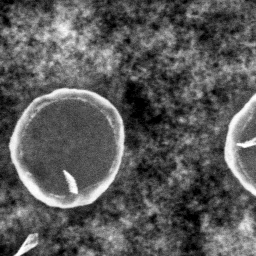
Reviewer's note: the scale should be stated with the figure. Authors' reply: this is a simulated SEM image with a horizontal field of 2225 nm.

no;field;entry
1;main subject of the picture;raised bodies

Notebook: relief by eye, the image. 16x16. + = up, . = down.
................
................
................
................
................
................
..+++++.........
.+++++++.......+
.+++++++......++
.+++++++......++
.++++++........+
..+++++........+
...+++..........
................
................
................